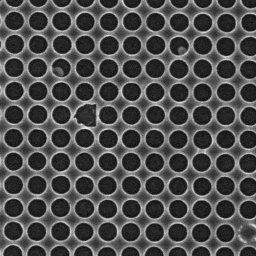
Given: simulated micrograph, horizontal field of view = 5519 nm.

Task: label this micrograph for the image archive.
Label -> a regular array of holes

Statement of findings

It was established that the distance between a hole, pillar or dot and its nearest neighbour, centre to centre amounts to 495 nm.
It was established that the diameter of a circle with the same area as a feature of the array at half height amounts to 19.3 pixels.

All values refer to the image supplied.